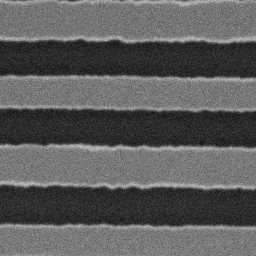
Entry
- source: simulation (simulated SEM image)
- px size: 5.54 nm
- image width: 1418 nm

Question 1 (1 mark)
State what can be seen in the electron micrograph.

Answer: lines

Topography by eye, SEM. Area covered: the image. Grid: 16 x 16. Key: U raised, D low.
UUUUUUUUUUUUUUUU
UUUUUUUUUUUUUUUU
UUUUUUUUUUUUUUUU
DDDDDDDDDDDDDDDD
DDDDDDDDDDDDDDDD
UUUUUUUUUUUUUUUU
UUUUUUUUUUUUUUUU
DDDDDDDDDDDDDDDD
DDDDDDDDDDDDDDDD
UUUUUUUUUUUUUUUU
UUUUUUUUUUUUUUUU
UUUUUUUUUUUUUUUU
DDDDDDDDDDDDDDDD
DDDDDDDDDDDDDDDD
UUUUUUUUUUUUUUUU
UUUUUUUUUUUUUUUU